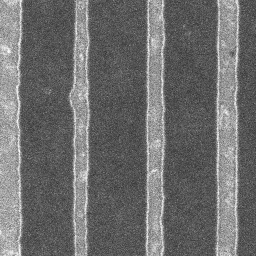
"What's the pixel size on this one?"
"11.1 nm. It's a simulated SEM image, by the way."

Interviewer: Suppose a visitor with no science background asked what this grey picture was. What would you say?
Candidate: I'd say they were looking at one or a few lines or trenches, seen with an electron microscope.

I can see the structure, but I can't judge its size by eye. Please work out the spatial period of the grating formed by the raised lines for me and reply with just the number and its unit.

797 nm